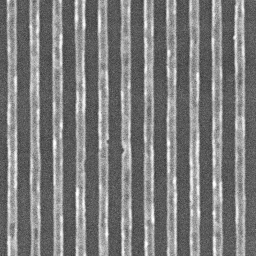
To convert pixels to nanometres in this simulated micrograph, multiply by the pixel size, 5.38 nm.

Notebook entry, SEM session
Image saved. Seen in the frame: parallel lines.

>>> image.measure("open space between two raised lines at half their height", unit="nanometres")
76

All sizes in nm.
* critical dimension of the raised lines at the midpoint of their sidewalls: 45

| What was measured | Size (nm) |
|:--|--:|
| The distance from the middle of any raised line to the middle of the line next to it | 122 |